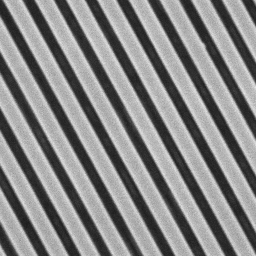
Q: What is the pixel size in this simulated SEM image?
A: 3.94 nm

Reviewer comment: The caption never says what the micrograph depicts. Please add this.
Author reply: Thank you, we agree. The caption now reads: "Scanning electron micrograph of parallel lines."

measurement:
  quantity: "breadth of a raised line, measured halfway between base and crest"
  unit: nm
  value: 66.9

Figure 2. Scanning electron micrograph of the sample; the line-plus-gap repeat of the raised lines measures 108 nm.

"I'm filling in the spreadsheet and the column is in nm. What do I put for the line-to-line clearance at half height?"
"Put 42.3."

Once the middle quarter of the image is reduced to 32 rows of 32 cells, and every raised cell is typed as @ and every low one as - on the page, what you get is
--@@@@@---@@@@---@@@@@---@@@@@--
--@@@@@---@@@@@---@@@@@---@@@@--
---@@@@@---@@@@---@@@@@---@@@@@-
---@@@@@---@@@@@---@@@@@---@@@@-
@---@@@@@---@@@@----@@@@---@@@@@
@----@@@@---@@@@@---@@@@@---@@@@
@@---@@@@@---@@@@----@@@@----@@@
@@----@@@@----@@@@---@@@@@---@@@
@@@---@@@@@---@@@@@---@@@@----@@
@@@@---@@@@----@@@@---@@@@@---@@
@@@@---@@@@@---@@@@@---@@@@@---@
@@@@@---@@@@@---@@@@---@@@@@---@
@@@@@---@@@@@---@@@@@---@@@@@---
-@@@@@---@@@@@---@@@@---@@@@@---
--@@@@---@@@@@---@@@@@---@@@@@--
--@@@@@---@@@@@---@@@@----@@@@--
---@@@@----@@@@---@@@@@---@@@@@-
---@@@@@---@@@@@---@@@@@---@@@@-
@---@@@@----@@@@----@@@@---@@@@@
@---@@@@@---@@@@@---@@@@@---@@@@
@@---@@@@@---@@@@----@@@@---@@@@
@@---@@@@@---@@@@@---@@@@@---@@@
@@@---@@@@@---@@@@@---@@@@---@@@
@@@---@@@@@---@@@@@---@@@@@---@@
@@@@---@@@@@---@@@@@---@@@@----@
@@@@----@@@@----@@@@---@@@@@---@
@@@@@---@@@@@---@@@@@---@@@@----
-@@@@@---@@@@----@@@@----@@@@---
-@@@@@---@@@@@---@@@@@---@@@@@--
--@@@@@---@@@@@---@@@@----@@@@--
---@@@@---@@@@@---@@@@@---@@@@@-
---@@@@@---@@@@@---@@@@@---@@@@-